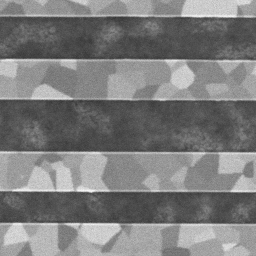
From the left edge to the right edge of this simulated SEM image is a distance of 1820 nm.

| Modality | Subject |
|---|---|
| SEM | one or a few lines or trenches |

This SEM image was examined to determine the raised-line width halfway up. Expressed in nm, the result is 275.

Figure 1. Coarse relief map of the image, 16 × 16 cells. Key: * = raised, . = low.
****************
................
................
................
****************
****************
................
................
................
................
****************
****************
................
................
****************
****************